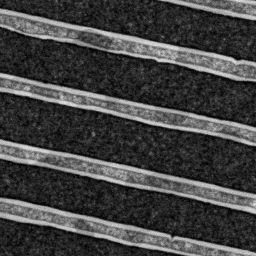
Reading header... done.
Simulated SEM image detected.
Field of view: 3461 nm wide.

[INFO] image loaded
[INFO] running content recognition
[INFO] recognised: one or a few lines or trenches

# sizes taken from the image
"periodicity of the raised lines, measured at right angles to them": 837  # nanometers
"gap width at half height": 638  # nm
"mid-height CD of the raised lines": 200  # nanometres